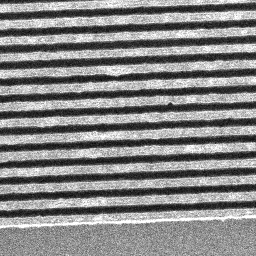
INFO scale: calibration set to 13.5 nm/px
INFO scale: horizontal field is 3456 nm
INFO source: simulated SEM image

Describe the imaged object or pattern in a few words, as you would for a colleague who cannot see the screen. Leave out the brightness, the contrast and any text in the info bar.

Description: parallel lines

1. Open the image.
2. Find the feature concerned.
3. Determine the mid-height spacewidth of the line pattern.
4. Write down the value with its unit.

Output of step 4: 104 nanometers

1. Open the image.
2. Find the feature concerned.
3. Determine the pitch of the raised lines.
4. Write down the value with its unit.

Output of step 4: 0.222 µm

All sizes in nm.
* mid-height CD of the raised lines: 118